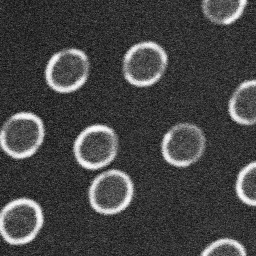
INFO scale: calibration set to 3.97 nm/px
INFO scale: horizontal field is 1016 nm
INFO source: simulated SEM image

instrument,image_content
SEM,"raised bodies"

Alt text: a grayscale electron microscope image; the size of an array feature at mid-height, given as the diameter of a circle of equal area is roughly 0.163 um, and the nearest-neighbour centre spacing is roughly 302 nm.